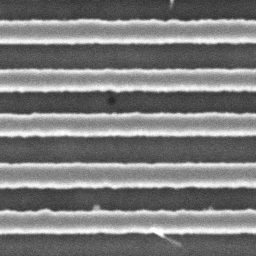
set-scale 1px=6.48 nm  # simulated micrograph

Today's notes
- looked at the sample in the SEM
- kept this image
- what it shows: lines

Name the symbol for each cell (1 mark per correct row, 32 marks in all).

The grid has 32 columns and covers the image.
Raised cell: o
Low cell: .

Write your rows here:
................................
................................
....o....ooo......oo.o...oooooo.
oooooooooooooooooooooooooooooooo
oooooooooooooooooooooooooooooooo
................................
................................
................................
................................
oooooooooooooooooooooooooooooooo
oooooooooooooooooooooooooooooooo
................................
................................
................................
oooooooooooooooooooooooooooooooo
oooooooooooooooooooooooooooooooo
oooooooooooooooooooooooooooooooo
................................
................................
................................
o.oooooooooooooooooooooooooooooo
oooooooooooooooooooooooooooooooo
oooooooooooooooooooooooooooooooo
.....o.oo.....o.................
................................
................................
oo.ooooooooooooooooooooooooooooo
oooooooooooooooooooooooooooooooo
oooooooooooooooooooooooooooooooo
................................
................................
................................